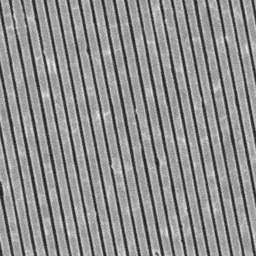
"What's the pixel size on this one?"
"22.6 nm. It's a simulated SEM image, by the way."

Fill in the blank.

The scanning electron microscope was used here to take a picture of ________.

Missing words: parallel lines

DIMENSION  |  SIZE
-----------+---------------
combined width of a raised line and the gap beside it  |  256 nm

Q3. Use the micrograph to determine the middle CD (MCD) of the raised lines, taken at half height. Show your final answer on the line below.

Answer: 169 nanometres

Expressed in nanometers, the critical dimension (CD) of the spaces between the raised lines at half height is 86.1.